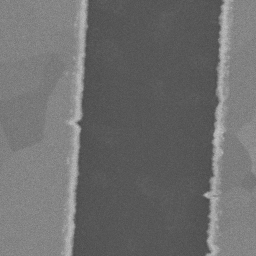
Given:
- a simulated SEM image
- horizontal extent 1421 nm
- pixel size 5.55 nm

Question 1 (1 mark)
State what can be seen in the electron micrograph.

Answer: one or a few lines or trenches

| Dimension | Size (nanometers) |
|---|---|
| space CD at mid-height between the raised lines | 787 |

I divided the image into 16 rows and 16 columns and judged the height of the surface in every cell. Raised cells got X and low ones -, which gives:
XXXXX---------XX
XXXXX---------XX
XXXXX---------XX
XXXXX---------XX
XXXXX---------XX
XXXXX---------XX
XXXXX---------XX
XXXXX---------XX
XXXXX---------XX
XXXXX---------XX
XXXXX--------XXX
XXXXX--------XXX
XXXX---------XXX
XXXX---------XXX
XXXX---------XXX
XXXX---------XXX